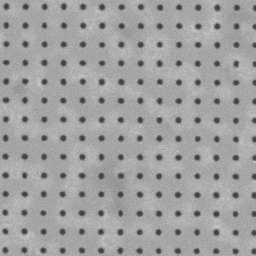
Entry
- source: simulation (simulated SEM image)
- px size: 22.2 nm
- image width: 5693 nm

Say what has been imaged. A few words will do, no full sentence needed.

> a regular array of holes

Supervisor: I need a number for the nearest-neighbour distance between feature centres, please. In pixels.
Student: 18.6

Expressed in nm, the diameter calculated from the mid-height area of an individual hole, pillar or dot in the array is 142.